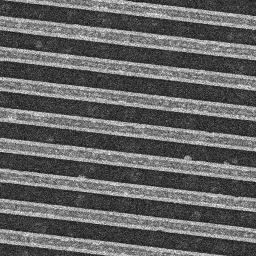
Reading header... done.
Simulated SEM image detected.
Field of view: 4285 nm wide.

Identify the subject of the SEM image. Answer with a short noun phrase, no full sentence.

parallel lines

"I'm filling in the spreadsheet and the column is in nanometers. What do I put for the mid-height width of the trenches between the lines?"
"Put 328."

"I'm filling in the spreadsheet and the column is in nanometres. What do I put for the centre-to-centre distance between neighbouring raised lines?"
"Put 506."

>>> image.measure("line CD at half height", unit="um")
0.172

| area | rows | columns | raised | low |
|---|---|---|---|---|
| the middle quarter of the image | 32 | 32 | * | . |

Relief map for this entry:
*********************...........
........**********************..
...............*****************
..........................******
................................
................................
********........................
****************................
..***********************.......
...........*********************
...................*************
............................****
................................
***.............................
************....................
********************............
......***********************...
...............*****************
.......................*********
...............................*
................................
*******.........................
****************................
.***********************........
..........**********************
..................**************
...........................*****
................................
................................
*********.......................
*****************...............
.....*********************......